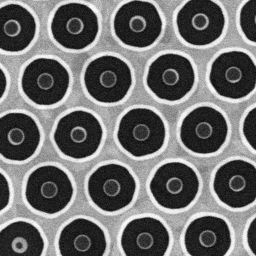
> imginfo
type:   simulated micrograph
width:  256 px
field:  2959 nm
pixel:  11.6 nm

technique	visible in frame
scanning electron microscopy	an array of small figures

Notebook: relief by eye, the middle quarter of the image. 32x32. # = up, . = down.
#####............####...........
.####............####...........
..###.....##.....###.....###....
..##.....####....###.....###....
..###....####.....##.....###....
..###.....##.....###............
.####............####...........
.#####..........######..........
#######........########.......##
########......############...###
##################.#############
##...###########.......########.
.......########.........######..
.........#####...........#####..
.........#####...........####...
..........###.....##.....####...
..###.....###.....###.....###...
..###.....###.....###.....##....
..###.....###.....###.....###...
..........###............####...
.........#####...........#####..
.........######.........#######.
........########.......#########
#......###########..############
###########..############.....##
#########......#########........
#######..........######.........
.#####...........#####..........
..####............####..........
..####.....##.....###.....###...
...###....####....###.....###...
...###....####....###.....###...